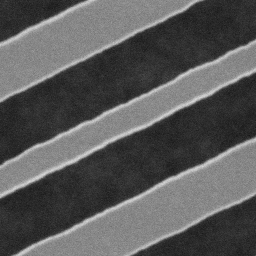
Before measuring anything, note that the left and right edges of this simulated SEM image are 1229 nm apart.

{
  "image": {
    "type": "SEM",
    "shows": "lines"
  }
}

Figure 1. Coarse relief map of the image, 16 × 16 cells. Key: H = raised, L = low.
LLLLHHHHHHHHLLLL
LLHHHHHHHHLLLLLL
HHHHHHHHLLLLLLLL
HHHHHHLLLLLLLLHH
HHHHLLLLLLLLHHHH
HHLLLLLLLLHHHHLL
LLLLLLLLHHHHLLLL
LLLLLLHHHHLLLLLL
LLLLHHHHLLLLLLLL
LHHHHHLLLLLLLLHH
HHHHLLLLLLLLHHHH
HHLLLLLLLLHHHHHH
LLLLLLLLHHHHHHHL
LLLLLLHHHHHHHLLL
LLLLHHHHHHHLLLLL
LLHHHHHHHLLLLLLL